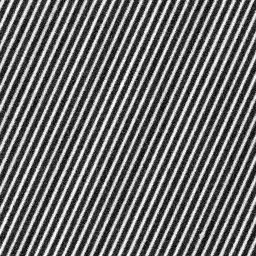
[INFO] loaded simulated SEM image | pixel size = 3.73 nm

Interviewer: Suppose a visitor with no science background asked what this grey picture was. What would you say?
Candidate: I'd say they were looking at parallel lines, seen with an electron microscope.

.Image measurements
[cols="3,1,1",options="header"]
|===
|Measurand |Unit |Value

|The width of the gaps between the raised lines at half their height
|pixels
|5.92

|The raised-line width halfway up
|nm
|7.2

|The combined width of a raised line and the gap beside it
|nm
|31.5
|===